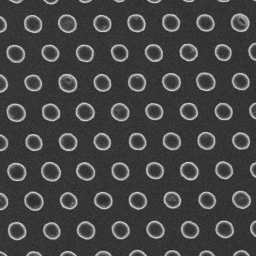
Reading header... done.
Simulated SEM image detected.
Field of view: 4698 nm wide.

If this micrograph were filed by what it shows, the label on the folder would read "a regular array of raised bodies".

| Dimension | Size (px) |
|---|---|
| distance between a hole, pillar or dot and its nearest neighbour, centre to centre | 34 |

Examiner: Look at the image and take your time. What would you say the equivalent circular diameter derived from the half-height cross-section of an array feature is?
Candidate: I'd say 0.304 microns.